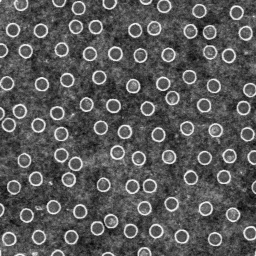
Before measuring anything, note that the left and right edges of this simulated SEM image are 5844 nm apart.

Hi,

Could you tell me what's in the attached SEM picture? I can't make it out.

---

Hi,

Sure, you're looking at a regular array of raised bodies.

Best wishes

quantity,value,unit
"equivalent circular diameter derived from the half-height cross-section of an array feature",290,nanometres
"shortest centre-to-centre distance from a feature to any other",0.551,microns